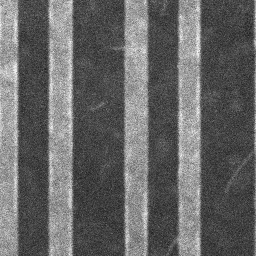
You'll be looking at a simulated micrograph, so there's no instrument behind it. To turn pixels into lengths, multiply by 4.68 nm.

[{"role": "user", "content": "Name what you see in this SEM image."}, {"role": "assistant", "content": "one or a few lines or trenches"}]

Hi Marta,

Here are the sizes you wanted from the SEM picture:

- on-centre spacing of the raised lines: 301 nm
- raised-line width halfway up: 102 nm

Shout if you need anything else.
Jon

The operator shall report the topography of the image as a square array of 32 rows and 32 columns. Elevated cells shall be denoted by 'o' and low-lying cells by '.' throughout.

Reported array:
oo....ooo.......oo....ooo.......
oo....ooo.......oo....ooo.......
oo....ooo.......oo....ooo.......
oo....ooo.......oo....ooo.......
oo....ooo.......oo....ooo.......
oo....ooo.......oo....ooo.......
oo....ooo.......oo....ooo.......
oo....ooo.......oo....ooo.......
oo....ooo.......oo....ooo.......
oo....ooo.......oo....ooo.......
oo....ooo.......oo....ooo.......
oo....ooo.......oo....ooo.......
oo....ooo.......oo....ooo.......
oo....ooo.......oo....ooo.......
oo....ooo.......oo....ooo.......
oo....ooo.......oo....ooo.......
oo....ooo.......oo....ooo.......
oo....ooo.......oo....ooo.......
oo....ooo.......oo....ooo.......
oo....ooo.......oo....ooo.......
oo....ooo.......oo....ooo.......
oo....ooo.......oo....ooo.......
oo....ooo.......oo....ooo.......
oo....ooo.......oo....ooo.......
oo....ooo.......oo....ooo.......
oo....ooo.......oo....ooo.......
oo....ooo.......oo....ooo.......
oo....ooo.......oo....ooo.......
oo....ooo.......oo....ooo.......
oo....ooo.......oo....ooo.......
oo....ooo.......oo....ooo.......
oo....ooo.......oo....ooo.......